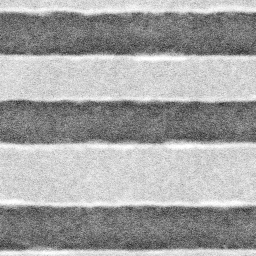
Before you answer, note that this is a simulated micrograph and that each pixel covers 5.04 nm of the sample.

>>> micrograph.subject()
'lines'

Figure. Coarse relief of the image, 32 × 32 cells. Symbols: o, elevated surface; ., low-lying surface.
oooooooooooooooooooooooooooooooo
................................
................................
................................
................................
................................
................................
oooooooooooooooooooooooooooooooo
oooooooooooooooooooooooooooooooo
oooooooooooooooooooooooooooooooo
oooooooooooooooooooooooooooooooo
oooooooooooooooooooooooooooooooo
....ooo.....o.o..oo.oooooooooooo
................................
................................
................................
................................
................................
oooooooooooooooooooooooooooooooo
oooooooooooooooooooooooooooooooo
oooooooooooooooooooooooooooooooo
oooooooooooooooooooooooooooooooo
oooooooooooooooooooooooooooooooo
oooooooooooooooooooooooooooooooo
oooooooooooooooooooooooooooooooo
......ooo.ooooo........ooooooo..
................................
................................
................................
................................
................................
oooooooooooooooooooooooooooooooo